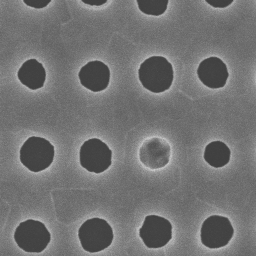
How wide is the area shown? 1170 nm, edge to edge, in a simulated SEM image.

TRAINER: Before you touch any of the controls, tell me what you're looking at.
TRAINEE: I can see a regular array of holes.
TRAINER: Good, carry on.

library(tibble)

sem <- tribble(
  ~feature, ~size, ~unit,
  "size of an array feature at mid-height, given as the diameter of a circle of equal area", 150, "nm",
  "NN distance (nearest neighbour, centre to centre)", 276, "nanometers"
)